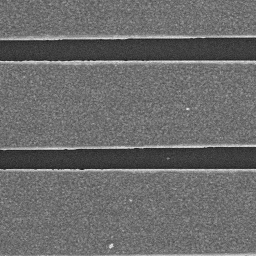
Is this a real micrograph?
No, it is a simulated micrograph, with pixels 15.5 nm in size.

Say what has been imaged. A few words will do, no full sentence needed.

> lines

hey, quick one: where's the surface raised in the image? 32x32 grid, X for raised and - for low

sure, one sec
XXXXXXXXXXXXXXXXXXXXXXXXXXXXXXXX
XXXXXXXXXXXXXXXXXXXXXXXXXXXXXXXX
XXXXXXXXXXXXXXXXXXXXXXXXXXXXXXXX
XXXXXXXXXXXXXXXXXXXXXXXXXXXXXXXX
XXXXXXXXXXXXXXXXXXXXXXXXXXXXXXXX
--------------------------------
--------------------------------
--------------------------------
XXXXXXXXXXXXXXXXXXXXXXXXXXXXXXXX
XXXXXXXXXXXXXXXXXXXXXXXXXXXXXXXX
XXXXXXXXXXXXXXXXXXXXXXXXXXXXXXXX
XXXXXXXXXXXXXXXXXXXXXXXXXXXXXXXX
XXXXXXXXXXXXXXXXXXXXXXXXXXXXXXXX
XXXXXXXXXXXXXXXXXXXXXXXXXXXXXXXX
XXXXXXXXXXXXXXXXXXXXXXXXXXXXXXXX
XXXXXXXXXXXXXXXXXXXXXXXXXXXXXXXX
XXXXXXXXXXXXXXXXXXXXXXXXXXXXXXXX
XXXXXXXXXXXXXXXXXXXXXXXXXXXXXXXX
XXXXXXXXXXXXXXXXX---------------
--------------------------------
--------------------------------
XXXXXXXXXXXXXXXXXXXXXXXXXXXXXXXX
XXXXXXXXXXXXXXXXXXXXXXXXXXXXXXXX
XXXXXXXXXXXXXXXXXXXXXXXXXXXXXXXX
XXXXXXXXXXXXXXXXXXXXXXXXXXXXXXXX
XXXXXXXXXXXXXXXXXXXXXXXXXXXXXXXX
XXXXXXXXXXXXXXXXXXXXXXXXXXXXXXXX
XXXXXXXXXXXXXXXXXXXXXXXXXXXXXXXX
XXXXXXXXXXXXXXXXXXXXXXXXXXXXXXXX
XXXXXXXXXXXXXXXXXXXXXXXXXXXXXXXX
XXXXXXXXXXXXXXXXXXXXXXXXXXXXXXXX
XXXXXXXXXXXXXXXXXXXXXXXXXXXXXXXX